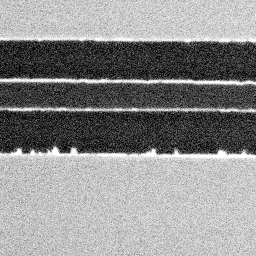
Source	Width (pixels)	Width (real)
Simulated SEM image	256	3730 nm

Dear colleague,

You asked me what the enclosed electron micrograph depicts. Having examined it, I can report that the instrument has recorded lines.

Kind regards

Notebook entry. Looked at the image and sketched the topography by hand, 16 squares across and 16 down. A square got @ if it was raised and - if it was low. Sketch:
@@@@@@@@@@@@@@@@
@@@@@@@@@@@@@@@@
-----------@-@@@
----------------
----------------
@@@@@@@@@@@@@@@@
@@@@@@@@@@@@@@@@
----------------
----------------
----------------
@@@@@@@@@@@@@@@@
@@@@@@@@@@@@@@@@
@@@@@@@@@@@@@@@@
@@@@@@@@@@@@@@@@
@@@@@@@@@@@@@@@@
@@@@@@@@@@@@@@@@